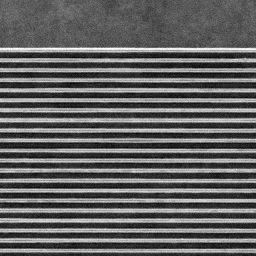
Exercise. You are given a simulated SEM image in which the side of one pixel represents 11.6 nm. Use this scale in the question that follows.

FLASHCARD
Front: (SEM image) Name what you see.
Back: parallel lines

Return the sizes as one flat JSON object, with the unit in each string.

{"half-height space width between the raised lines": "0.0829 µm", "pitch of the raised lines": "0.117 um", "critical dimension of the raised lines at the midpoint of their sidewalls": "30.5 nanometers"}